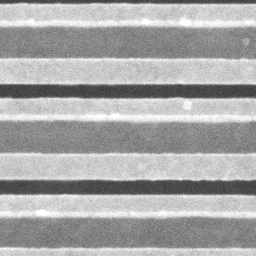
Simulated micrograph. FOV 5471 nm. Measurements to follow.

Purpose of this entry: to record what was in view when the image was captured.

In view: lines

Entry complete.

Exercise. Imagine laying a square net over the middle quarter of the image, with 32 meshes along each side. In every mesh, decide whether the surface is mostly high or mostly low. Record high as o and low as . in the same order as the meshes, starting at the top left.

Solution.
oooooooooooooooooooooooooooooooo
oooooooooooooooooooooooooooooooo
oooooooooooooooooooooooooooooooo
oooooooooooooooooooooooooooooooo
oooooooooooooooooooooooooooooooo
................................
................................
................................
................................
oooooooooooooooooooooooooooooooo
oooooooooooooooooooooooooooooooo
oooooooooooooooooooooooooooooooo
oooooooooooooooooooooooooooooooo
............o...................
................................
................................
................................
................................
................................
................................
................................
................................
................................
oooooooooooooooooooooooooooooooo
oooooooooooooooooooooooooooooooo
oooooooooooooooooooooooooooooooo
oooooooooooooooooooooooooooooooo
oooooooooooooooooooooooooooooooo
oooooooooooooooooooooooooooooooo
................................
................................
................................